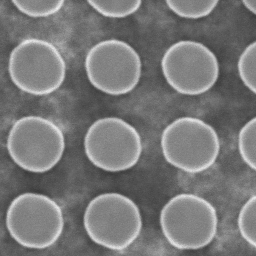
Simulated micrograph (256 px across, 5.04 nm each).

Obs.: a regular array of raised bodies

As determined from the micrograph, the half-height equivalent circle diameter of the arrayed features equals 274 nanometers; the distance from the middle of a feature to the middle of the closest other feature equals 386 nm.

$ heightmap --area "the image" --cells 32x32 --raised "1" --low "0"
00111111000111111000011111100001
00011110000001111000001111000000
00000000000000000000000000000000
00000000000000000000000000000000
00000000000000000000000000000000
00011100000011110000001110000000
00111110000111111000011111000001
01111111000111111000111111100011
01111111000111111000111111100011
01111111000111111000011111100011
00111110000011111000011111100001
00001100000001110000000110000000
00000000000000000000000000000000
00000000000000000000000000000000
00000000000000000000000000000000
00111100000011110000011111000001
01111111000111111000011111100011
01111111000111111000111111100011
01111111000111111100111111100011
01111111000111111000011111100011
00111110000011111000001111000001
00000000000000000000000000000000
00000000000000000000000000000000
00000000000000000000000000000000
00011000000011100000000100000000
00111110000111111000011111000001
01111110000111111000111111100011
01111111000111111000111111100011
01111111000111111000111111100011
00111110000111111000011111100001
00011100000001110000011111000000
00000000000000000000000000000000